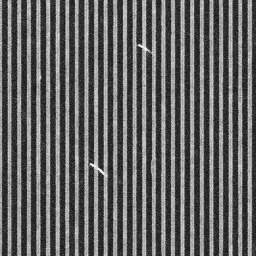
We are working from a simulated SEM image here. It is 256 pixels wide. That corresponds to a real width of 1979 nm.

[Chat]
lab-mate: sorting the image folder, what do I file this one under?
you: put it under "parallel lines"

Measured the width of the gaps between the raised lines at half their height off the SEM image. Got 52.2 nm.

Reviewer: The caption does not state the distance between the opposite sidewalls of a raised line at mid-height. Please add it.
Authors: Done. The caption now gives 0.0193 micrometres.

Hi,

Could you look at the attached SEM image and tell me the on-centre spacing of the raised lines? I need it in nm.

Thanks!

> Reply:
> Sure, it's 74.3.